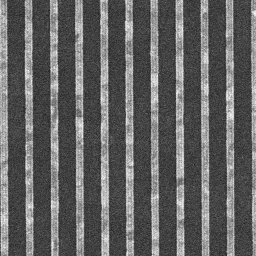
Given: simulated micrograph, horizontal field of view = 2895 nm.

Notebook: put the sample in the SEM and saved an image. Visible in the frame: parallel lines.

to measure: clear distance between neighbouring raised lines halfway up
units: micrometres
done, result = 0.213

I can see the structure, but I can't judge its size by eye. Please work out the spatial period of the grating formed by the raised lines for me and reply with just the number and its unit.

284 nanometres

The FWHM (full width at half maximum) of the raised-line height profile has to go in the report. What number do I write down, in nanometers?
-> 67.9